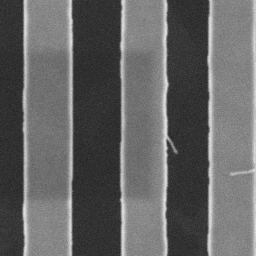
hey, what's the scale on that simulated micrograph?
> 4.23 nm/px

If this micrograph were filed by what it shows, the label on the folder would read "lines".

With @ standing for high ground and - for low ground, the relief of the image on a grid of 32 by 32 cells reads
---@@@@@@------@@@@@@-----@@@@@@
---@@@@@@------@@@@@@-----@@@@@@
---@@@@@@------@@@@@@-----@@@@@@
---@@@@@@------@@@@@@-----@@@@@@
---@@@@@@------@@@@@@-----@@@@@@
---@@@@@@------@@@@@@-----@@@@@@
---@@@@@@------@@@@@@-----@@@@@@
---@@@@@@------@@@@@@-----@@@@@@
---@@@@@@------@@@@@@-----@@@@@@
---@@@@@@------@@@@@@-----@@@@@@
---@@@@@@------@@@@@@-----@@@@@@
---@@@@@@------@@@@@@-----@@@@@@
---@@@@@@------@@@@@@-----@@@@@@
---@@@@@@------@@@@@@-----@@@@@@
---@@@@@@------@@@@@@-----@@@@@@
---@@@@@@------@@@@@@-----@@@@@@
---@@@@@@------@@@@@@-----@@@@@@
---@@@@@@------@@@@@@-----@@@@@@
---@@@@@@------@@@@@@-----@@@@@@
---@@@@@@------@@@@@@-----@@@@@@
---@@@@@@------@@@@@@-----@@@@@@
---@@@@@@------@@@@@@-----@@@@@@
---@@@@@@------@@@@@@-----@@@@@@
---@@@@@@------@@@@@@-----@@@@@@
---@@@@@@------@@@@@@-----@@@@@@
---@@@@@@------@@@@@@-----@@@@@@
---@@@@@@------@@@@@@-----@@@@@@
---@@@@@@------@@@@@@-----@@@@@@
---@@@@@@------@@@@@@-----@@@@@@
---@@@@@@------@@@@@@-----@@@@@@
---@@@@@@------@@@@@@-----@@@@@@
---@@@@@@------@@@@@@-----@@@@@@